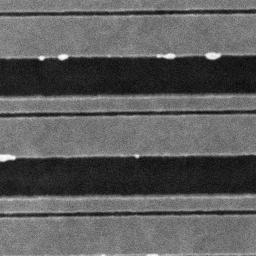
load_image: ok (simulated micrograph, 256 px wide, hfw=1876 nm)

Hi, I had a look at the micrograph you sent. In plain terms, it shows lines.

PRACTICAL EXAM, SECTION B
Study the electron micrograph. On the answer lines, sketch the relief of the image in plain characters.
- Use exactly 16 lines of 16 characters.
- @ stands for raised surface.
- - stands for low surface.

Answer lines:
@@@@@@@@@@@@@@@@
@@@@@@@@@@@@@@@@
@@@@@@@@@@@@@@@@
@@@@@@@@-@@--@--
----------------
----------------
@@@@@@@@@@@@@@@@
@@@@@@@@@@@@@@@@
@@@@@@@@@@@@@@@@
@@@@@@@@@@@@@@@@
----------------
----------------
@@@@@@@@@@@@@@@@
@@@@@@@@@@@@@@@@
@@@@@@@@@@@@@@@@
@@@@@@@@@@@@@@@@